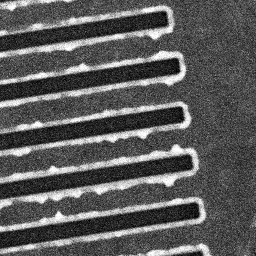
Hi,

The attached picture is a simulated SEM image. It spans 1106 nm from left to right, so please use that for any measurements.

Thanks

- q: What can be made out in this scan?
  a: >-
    parallel lines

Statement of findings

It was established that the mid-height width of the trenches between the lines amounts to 0.0709 micrometres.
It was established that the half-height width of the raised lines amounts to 138 nanometers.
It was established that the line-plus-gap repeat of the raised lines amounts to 0.21 microns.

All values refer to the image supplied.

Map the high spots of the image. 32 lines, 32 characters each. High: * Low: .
********************************
******************...***********
************.........***********
******...............***********
.............*******************
.......*************************
********************************
********************..**********
**************.........*********
*******..............***********
*..............*****************
........************************
..******************************
*********************..*********
**************.........*********
********..............**********
*...............****************
.........***********************
...*****************************
*********************...********
***************.........********
********...............*********
**..............****************
..........**********************
...*****************************
***********************..*******
****************.........*******
**********.............*********
***..............***************
...........*********************
....****************************
************************.*******